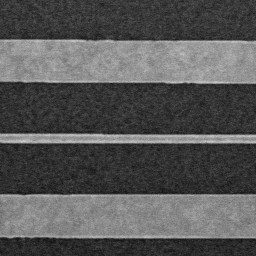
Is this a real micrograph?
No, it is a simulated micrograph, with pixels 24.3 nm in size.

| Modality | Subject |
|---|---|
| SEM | lines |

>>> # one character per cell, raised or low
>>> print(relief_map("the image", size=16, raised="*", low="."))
................
................
................
****************
****************
................
................
................
................
................
................
................
****************
****************
****************
................